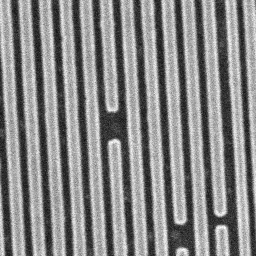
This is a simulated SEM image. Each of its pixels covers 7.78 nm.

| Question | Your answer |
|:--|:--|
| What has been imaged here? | parallel lines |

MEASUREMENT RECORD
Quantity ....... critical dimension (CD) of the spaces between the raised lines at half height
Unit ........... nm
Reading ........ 77.6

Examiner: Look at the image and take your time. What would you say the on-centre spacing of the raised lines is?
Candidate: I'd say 160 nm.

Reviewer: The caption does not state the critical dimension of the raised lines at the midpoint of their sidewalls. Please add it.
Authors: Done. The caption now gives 77.6 nm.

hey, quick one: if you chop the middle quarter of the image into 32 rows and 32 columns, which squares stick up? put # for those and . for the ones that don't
##...###..###..###..###...##...#
###..###..###...##...##...##...#
###..###..###...##...##...##...#
###..###..###...##...##...##...#
###..###..###...##...##...##...#
###..###...##...##...##...##...#
.##...##...##...##...##...##...#
.##...##...##...##...##...##...#
.##...##...##...##...##...##...#
.##...##...##...##...###..###..#
.##...##...##...##...###..###..#
.##...##...##...##...###..###..#
.##...##........##...###..###..#
.##...##........###..###..###..#
.##...##........###..###...##...
.##...##........###..###...##...
.##...##........###..###...##...
.##...##........###..###...##...
.###..###........##...##...##...
.###..###...##...##...##...##...
.###..###..###...##...##...##...
.###..###..###...##...##...##...
.###..###..###...##...##...##...
..##...##...##...##...##...##...
..##...##...##...##...##...##...
..##...##...##...##...##...##...
..##...##...##...##...###..###..
..##...##...##...##...###..###..
..##...##...##...##...###..###..
..##...##...##...##...###..###..
..##...##...##...##...###..###..
..##...##...##...###..###...##..